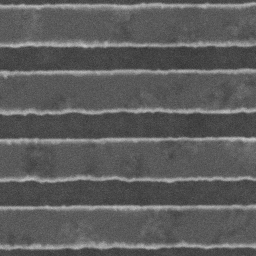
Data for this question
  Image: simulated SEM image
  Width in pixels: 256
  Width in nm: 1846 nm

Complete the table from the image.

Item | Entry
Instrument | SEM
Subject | lines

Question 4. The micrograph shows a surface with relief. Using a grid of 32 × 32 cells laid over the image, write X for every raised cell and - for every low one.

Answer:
------------------------------XX
XXXXXXXXXXXXXXXXXXXXXXXXXXXXXXXX
XXXXXXXXXXXXXXXXXXXXXXXXXXXXXXXX
XXXXXXXXXXXXXXXXXXXXXXXXXXXXXXXX
XXXXXXXXXXXXXXXXXXXXXXXXXXXXXXXX
XXXXXXXXXXXXXXXXXXXXXXXXXXXXXXXX
--------------------------------
--------------------------------
--------------------------------
XXXXXXXXXXXXXXXXXXXXXXXXXXXXXXXX
XXXXXXXXXXXXXXXXXXXXXXXXXXXXXXXX
XXXXXXXXXXXXXXXXXXXXXXXXXXXXXXXX
XXXXXXXXXXXXXXXXXXXXXXXXXXXXXXXX
XXXXXXXXXXXXXXXXXXXXXXXXXXXXXXXX
--------------------------------
--------------------------------
--------------------------------
XXXXXXXXXXXXXXXXXXXXXXXXXXXXXXXX
XXXXXXXXXXXXXXXXXXXXXXXXXXXXXXXX
XXXXXXXXXXXXXXXXXXXXXXXXXXXXXXXX
XXXXXXXXXXXXXXXXXXXXXXXXXXXXXXXX
XXXXXXXXXXXXXXXXXXXXXXXXXXXXXXXX
XXXXXXXXX--XX--XXXXXXXXXX-XXXX-X
--------------------------------
--------------------------------
--------------------------------
XXXXXXXXXXXXXXXXXXXXXXXXXXXXXXXX
XXXXXXXXXXXXXXXXXXXXXXXXXXXXXXXX
XXXXXXXXXXXXXXXXXXXXXXXXXXXXXXXX
XXXXXXXXXXXXXXXXXXXXXXXXXXXXXXXX
XXXXXXXXXXXXXXXXXXXXXXXXXXXXXXXX
--------------------------------